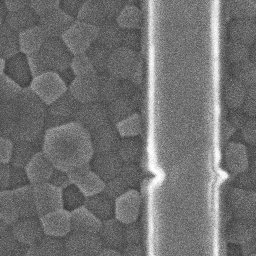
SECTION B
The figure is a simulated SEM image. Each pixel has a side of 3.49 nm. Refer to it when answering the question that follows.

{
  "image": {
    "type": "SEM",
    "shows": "one or a few lines or trenches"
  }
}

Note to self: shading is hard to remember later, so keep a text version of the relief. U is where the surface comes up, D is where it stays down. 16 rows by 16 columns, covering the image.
DDDDDDDDDUUUUUDD
DDDDDDDDDUUUUUDD
DDDDDDDDDUUUUUDD
DDDDDDDDDUUUUUDD
DDDDDDDDDUUUUUDD
DDDDDDDDDUUUUUDD
DDDDDDDDDUUUUUDD
DDDDDDDDDUUUUUDD
DDDDDDDDDUUUUUDD
DDDDDDDDDUUUUUDD
DDDDDDDDDUUUUUDD
DDDDDDDDDUUUUUDD
DDDDDDDDDUUUUUDD
DDDDDDDDDUUUUUDD
DDDDDDDDDUUUUUDD
DDDDDDDDDUUUUUDD